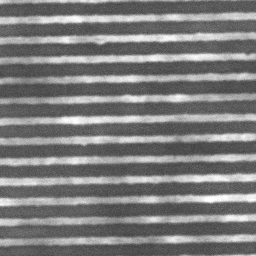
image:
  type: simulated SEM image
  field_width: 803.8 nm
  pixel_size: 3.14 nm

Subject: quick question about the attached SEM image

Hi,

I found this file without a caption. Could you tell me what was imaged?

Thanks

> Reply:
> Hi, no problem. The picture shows parallel lines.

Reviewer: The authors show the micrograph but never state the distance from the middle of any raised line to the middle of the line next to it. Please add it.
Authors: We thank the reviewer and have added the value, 63.3 nanometres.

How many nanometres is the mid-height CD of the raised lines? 16.9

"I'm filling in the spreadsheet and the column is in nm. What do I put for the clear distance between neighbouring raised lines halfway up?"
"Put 44.7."